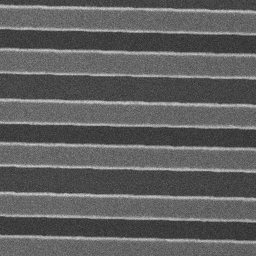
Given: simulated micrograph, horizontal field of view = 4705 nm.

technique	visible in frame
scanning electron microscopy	lines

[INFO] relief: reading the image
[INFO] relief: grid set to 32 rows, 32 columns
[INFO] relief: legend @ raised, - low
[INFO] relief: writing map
--------------------------------
@@@@@@@@@@@@@@@@@@@@@@@@@@@@@@@@
@@@@@@@@@@@@@@@@@@@@@@@@@@@@@@@@
@@@@@@@@@@@@@@@@@@@@@@@@@@@@@@@@
--------------------------------
--------------------------------
@@@@@@@@@@@@@@@-----------------
@@@@@@@@@@@@@@@@@@@@@@@@@@@@@@@@
@@@@@@@@@@@@@@@@@@@@@@@@@@@@@@@@
----------------@@@@@@@@@@@@@@@@
--------------------------------
--------------------------------
@@@@@@--------------------------
@@@@@@@@@@@@@@@@@@@@@@@@@@@@@@@@
@@@@@@@@@@@@@@@@@@@@@@@@@@@@@@@@
---@@@@@@@@@@@@@@@@@@@@@@@@@@@@@
--------------------------------
--------------------------------
@@@@@@@@@@@@@@@@@@@@@@@@@@@@@@--
@@@@@@@@@@@@@@@@@@@@@@@@@@@@@@@@
@@@@@@@@@@@@@@@@@@@@@@@@@@@@@@@@
-------------------------------@
--------------------------------
--------------------------------
@@@@@@@@@@@@@@@@@@@-------------
@@@@@@@@@@@@@@@@@@@@@@@@@@@@@@@@
@@@@@@@@@@@@@@@@@@@@@@@@@@@@@@@@
---------------------@@@@@@@@@@@
--------------------------------
@@@@----------------------------
@@@@@@@@@@@@@@@@@@@@@@@@@@@@@@@@
@@@@@@@@@@@@@@@@@@@@@@@@@@@@@@@@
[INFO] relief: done